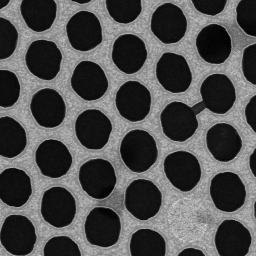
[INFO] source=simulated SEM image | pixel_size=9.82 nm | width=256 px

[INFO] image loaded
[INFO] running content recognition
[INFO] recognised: a regular array of holes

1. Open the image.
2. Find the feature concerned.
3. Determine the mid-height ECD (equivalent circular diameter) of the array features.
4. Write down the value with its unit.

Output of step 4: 370 nm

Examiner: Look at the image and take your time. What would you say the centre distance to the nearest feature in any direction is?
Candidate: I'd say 478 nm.